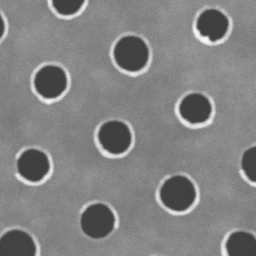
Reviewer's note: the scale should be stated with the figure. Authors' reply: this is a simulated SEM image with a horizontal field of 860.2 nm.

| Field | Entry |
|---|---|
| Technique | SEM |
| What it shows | a regular array of holes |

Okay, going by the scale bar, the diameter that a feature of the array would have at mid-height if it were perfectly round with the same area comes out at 111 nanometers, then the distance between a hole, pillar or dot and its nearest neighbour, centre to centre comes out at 0.284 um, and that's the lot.